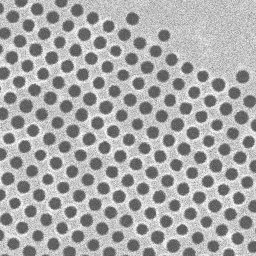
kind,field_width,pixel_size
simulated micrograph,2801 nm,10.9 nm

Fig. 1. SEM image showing a regular array of holes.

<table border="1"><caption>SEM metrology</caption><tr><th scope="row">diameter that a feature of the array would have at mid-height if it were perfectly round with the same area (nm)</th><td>148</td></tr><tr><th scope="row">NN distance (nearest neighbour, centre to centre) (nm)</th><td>193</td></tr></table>